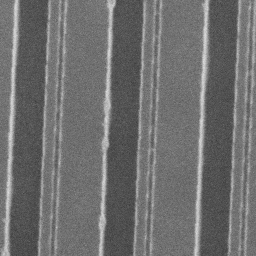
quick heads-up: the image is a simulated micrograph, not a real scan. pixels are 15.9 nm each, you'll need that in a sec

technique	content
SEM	lines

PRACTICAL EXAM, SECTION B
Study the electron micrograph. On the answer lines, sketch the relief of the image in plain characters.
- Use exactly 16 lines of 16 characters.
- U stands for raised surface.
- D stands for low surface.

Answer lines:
UDDUUUUDDUUUUDDU
UDDUUUUDDUUUUDDU
UDDUUUUDDUUUUDDU
UDDUUUUDDUUUUDDU
UDDUUUUDDUUUUDDU
UDDUUUUDDUUUUDDU
UDDUUUUDDUUUUDDU
UDDUUUUDDUUUUDDU
UDDUUUUDDUUUDDDU
UDDUUUUDDUUUDDDU
UDDUUUDDDUUUDDDU
DDDUUUDDDUUUDDUU
DDDUUUDDDUUUDDUU
DDDUUUDDUUUUDDUU
DDUUUUDDUUUUDDUU
DDUUUUDDUUUUDDUU